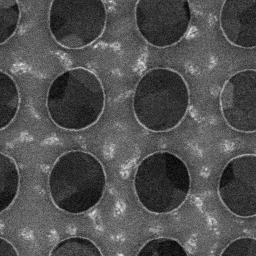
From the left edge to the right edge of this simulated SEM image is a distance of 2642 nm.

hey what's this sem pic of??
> raised bodies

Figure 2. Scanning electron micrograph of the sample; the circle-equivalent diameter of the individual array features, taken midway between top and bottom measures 625 nm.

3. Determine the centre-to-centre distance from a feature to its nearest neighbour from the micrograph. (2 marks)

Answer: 853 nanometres